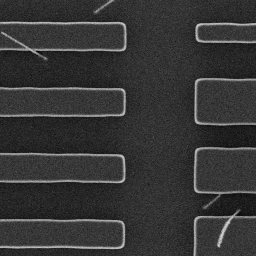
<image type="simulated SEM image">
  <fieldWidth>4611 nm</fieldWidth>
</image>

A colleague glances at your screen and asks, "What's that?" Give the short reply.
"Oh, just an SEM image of groups of lines, slits or small figures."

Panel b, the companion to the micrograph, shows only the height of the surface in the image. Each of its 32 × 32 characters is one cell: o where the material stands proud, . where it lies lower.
................................
................................
................................
oooooooooooooooo.........ooooooo
oooooooooooooooo.........ooooooo
oooooooooooooooo................
................................
................................
................................
................................
........................oooooooo
ooooooooooooooo.........oooooooo
oooooooooooooooo........oooooooo
oooooooooooooooo........oooooooo
........................oooooooo
................................
................................
................................
.........................ooo....
ooooooooooooooo.........oooooooo
ooooooooooooooo.........oooooooo
oooooooooooooooo........oooooooo
ooooooooooooooo.........oooooooo
........................oooooooo
................................
................................
................................
ooooooo..ooo............oooooooo
ooooooooooooooo.........oooooooo
ooooooooooooooo.........oooooooo
ooooooooooooooo.........oooooooo
........................oooooooo